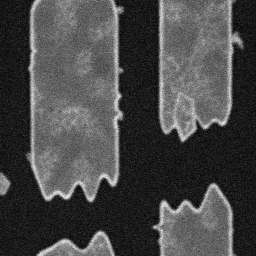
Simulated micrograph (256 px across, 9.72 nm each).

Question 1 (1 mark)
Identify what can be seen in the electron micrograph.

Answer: one or a few lines or trenches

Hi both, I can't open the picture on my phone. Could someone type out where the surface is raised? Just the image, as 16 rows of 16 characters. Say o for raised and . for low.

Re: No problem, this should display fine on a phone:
..ooooo...oooo..
..ooooo...oooo..
..ooooo...oooo..
..ooooo...oooo..
..ooooo...oooo..
..ooooo...oooo..
..ooooo...oooo..
..ooooo...oooo..
..ooooo....o....
..ooooo.........
..ooooo.........
..oooo..........
.............o..
..........oooo..
..........oooo..
...oooo...oooo..